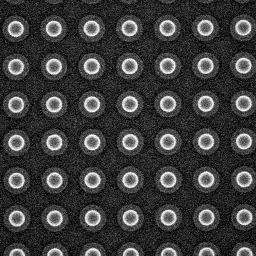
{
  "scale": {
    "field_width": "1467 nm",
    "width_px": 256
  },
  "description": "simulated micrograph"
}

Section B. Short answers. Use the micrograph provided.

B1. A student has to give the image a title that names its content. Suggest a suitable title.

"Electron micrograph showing an array of small figures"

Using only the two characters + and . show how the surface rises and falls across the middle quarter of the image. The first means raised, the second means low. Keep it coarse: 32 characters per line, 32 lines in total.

+...++++++...+++++++...++++++...
+...++++++...+++++++...++++++...
....++++++....+++++....++++++...
.....++++......+++.......++.....
................................
................................
................................
.....++++.....+++++.....++++....
....++++++....+++++....++++++...
+...++++++...+++++++...++++++...
+...++++++...+++++++...++++++...
....++++++....+++++....++++++...
.....++++.....+++++.....++++....
................................
................................
................................
......++.......+++.......++.....
.....+++++....+++++....++++++...
+...++++++...+++++++...++++++...
+...++++++...+++++++...++++++...
+...++++++...+++++++...++++++...
....++++++....+++++....++++++...
.....++++......+++.......++.....
................................
................................
................................
.....++++.....+++++.....++++....
....++++++....++++++...++++++...
+...++++++...+++++++...++++++...
+...++++++...+++++++...++++++...
+...++++++....++++++...++++++...
.....++++.....+++++.....++++....